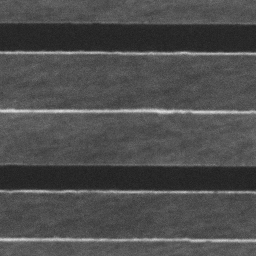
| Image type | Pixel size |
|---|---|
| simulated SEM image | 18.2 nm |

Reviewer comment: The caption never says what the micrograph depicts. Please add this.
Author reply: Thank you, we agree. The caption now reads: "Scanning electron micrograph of lines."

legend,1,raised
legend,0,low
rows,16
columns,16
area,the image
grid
1111111111111111
1111111111111111
1111111111111111
0000000000000000
0000000000000000
0000000000000000
0000000000000000
1111111111111111
1111111111111111
1111111111111111
1111111111111111
1111111111111111
0000000000000000
0000000000000000
0000000000000000
1111111111111111